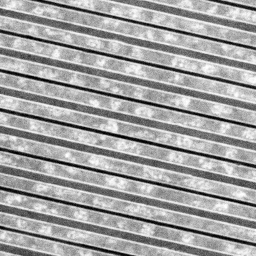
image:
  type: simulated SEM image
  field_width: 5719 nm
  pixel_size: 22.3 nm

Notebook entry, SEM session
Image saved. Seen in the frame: parallel lines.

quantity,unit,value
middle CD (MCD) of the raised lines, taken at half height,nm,281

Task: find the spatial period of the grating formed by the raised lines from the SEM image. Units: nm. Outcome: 428